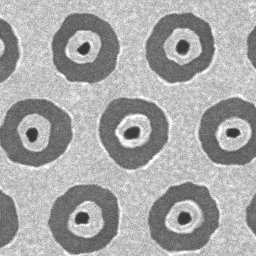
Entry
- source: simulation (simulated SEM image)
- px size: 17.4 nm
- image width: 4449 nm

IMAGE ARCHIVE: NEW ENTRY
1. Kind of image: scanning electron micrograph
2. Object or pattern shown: ring-shaped grooves with a dot in the middle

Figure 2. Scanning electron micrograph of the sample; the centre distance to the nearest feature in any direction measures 1660 nm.